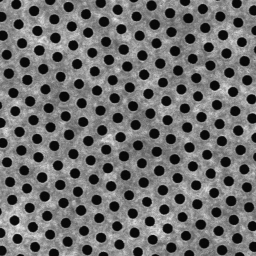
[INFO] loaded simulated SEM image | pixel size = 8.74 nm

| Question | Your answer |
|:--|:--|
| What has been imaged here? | a regular array of holes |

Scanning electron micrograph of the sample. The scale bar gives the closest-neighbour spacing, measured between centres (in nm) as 162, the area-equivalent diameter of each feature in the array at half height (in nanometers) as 88.8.